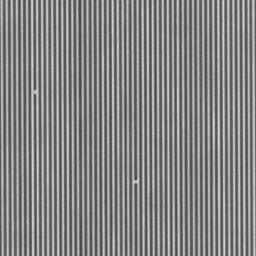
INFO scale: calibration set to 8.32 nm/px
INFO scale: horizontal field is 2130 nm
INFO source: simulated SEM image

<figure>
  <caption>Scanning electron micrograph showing parallel lines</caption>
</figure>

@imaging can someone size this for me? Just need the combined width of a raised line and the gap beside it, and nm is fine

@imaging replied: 41.8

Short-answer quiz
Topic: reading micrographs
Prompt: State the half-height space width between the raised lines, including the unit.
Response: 0.0281 um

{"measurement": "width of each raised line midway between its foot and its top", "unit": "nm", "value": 14.6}